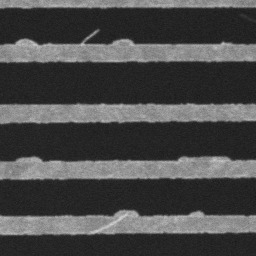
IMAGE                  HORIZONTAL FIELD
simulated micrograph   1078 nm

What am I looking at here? lines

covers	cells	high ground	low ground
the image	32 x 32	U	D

UUUUUUUUUUUUUUUUUUUUUUUUUUUUUUUU
DDDDDDDDDDDDDDDDDDDDDDDDDDDDDDDD
DDDDDDDDDDDDDDDDDDDDDDDDDDDDDDDD
DDDDDDDDDDDDDDDDDDDDDDDDDDDDDDDD
DDDDDDDDDDDDDDDDDDDDDDDDDDDDDDDD
DDUUDDDDDDUDDDUUUDDDDDDDDDDDDDDD
UUUUUUUUUUUUUUUUUUUUUUUUUUUUUUUU
UUUUUUUUUUUUUUUUUUUUUUUUUUUUUUUU
DDDDDDDDDDDDDDDDDDDDDDDDDDDDDDDD
DDDDDDDDDDDDDDDDDDDDDDDDDDDDDDDD
DDDDDDDDDDDDDDDDDDDDDDDDDDDDDDDD
DDDDDDDDDDDDDDDDDDDDDDDDDDDDDDDD
DDDDDDDDDDDDDDDDDDDDDDDDDDDDDDDD
UUUUUUUUUUUUUUUUUUUUUUUUUUUUUUUU
UUUUUUUUUUUUUUUUUUUUUUUUUUUUUUUU
DDDDDDDDDDDDDDDDDDDDDDDDDDDDDDDD
DDDDDDDDDDDDDDDDDDDDDDDDDDDDDDDD
DDDDDDDDDDDDDDDDDDDDDDDDDDDDDDDD
DDDDDDDDDDDDDDDDDDDDDDDDDDDDDDDD
DDDDDDDDDDDDDDDDDDDDDDDDDDDDDDDD
UUUUUUUUUUUUUUUUUUUUUUUUUUUUUUUU
UUUUUUUUUUUUUUUUUUUUUUUUUUUUUUUU
DDDDDDDDDDDDDDDDDDDDDDDDDDDDDDDD
DDDDDDDDDDDDDDDDDDDDDDDDDDDDDDDD
DDDDDDDDDDDDDDDDDDDDDDDDDDDDDDDD
DDDDDDDDDDDDDDDDDDDDDDDDDDDDDDDD
DDDDDDDDDDDDDDDUUDDDDDDDDDDDDDDD
UUUUUUUUUUUUUUUUUUUUUUUUUUUUUUUU
UUUUUUUUUUUUUUUUUUUUUUUUUUUUUUUU
DDDDDDDDDDDDDDDDDDDDDDDDDDDDDDDD
DDDDDDDDDDDDDDDDDDDDDDDDDDDDDDDD
DDDDDDDDDDDDDDDDDDDDDDDDDDDDDDDD